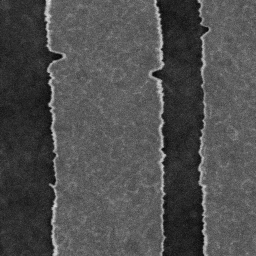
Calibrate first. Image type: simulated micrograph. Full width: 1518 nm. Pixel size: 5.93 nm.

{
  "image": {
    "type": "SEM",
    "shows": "one or a few lines or trenches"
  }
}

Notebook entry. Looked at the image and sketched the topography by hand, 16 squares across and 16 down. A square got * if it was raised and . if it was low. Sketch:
...*******...***
...*******...***
...*******...***
....******...***
...*******...***
...*******...***
...*******...***
...*******...***
...*******...***
...*******...***
...*******...***
...*******...***
...*******...***
...*******...***
...*******...***
...*******...***